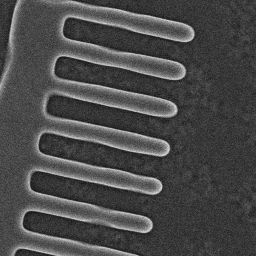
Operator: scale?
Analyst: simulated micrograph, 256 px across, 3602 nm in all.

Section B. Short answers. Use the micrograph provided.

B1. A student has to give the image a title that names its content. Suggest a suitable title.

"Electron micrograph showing groups of lines, slits or small figures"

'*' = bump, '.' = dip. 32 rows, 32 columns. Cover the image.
..********......................
..**************................
..******...**********...........
.*******........********........
.*******............****........
.**********.....................
.**************.................
.******...***********...........
.******........********.........
*******............****.........
***********.....................
****************................
******....***********...........
******.........*******..........
******..........................
***********.....................
****************................
*****......*********............
*****.........*******...........
******..........................
**********......................
****..**********................
****......**********............
****...........*****............
*******.........................
***********.....................
***..**********.................
***.......*********.............
***...........*****.............
******..........................
**********......................
**...***********................